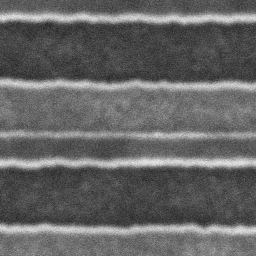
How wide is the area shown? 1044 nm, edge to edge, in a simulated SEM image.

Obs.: lines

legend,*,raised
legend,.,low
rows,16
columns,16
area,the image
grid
****************
................
................
................
................
****************
****************
****************
****************
****************
................
................
................
................
****************
****************